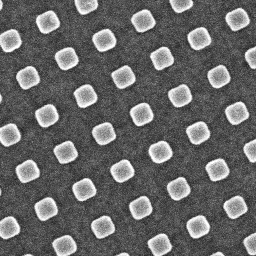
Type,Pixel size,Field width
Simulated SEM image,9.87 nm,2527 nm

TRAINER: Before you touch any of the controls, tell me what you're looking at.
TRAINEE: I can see a regular array of raised bodies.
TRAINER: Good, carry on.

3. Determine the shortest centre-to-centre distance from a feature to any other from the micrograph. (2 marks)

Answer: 410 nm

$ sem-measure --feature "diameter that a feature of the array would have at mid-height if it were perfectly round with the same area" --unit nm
212